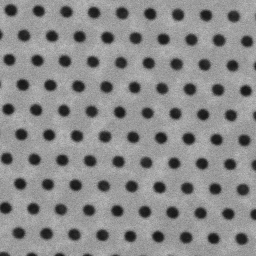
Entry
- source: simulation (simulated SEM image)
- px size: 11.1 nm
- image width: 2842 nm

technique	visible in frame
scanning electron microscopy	a regular array of holes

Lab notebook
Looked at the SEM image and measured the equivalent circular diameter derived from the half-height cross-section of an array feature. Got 0.13 micrometres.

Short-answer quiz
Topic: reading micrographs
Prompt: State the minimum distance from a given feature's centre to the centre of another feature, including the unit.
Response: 308 nm